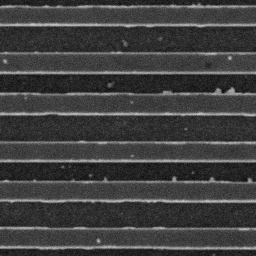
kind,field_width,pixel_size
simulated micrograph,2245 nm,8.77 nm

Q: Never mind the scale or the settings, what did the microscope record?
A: lines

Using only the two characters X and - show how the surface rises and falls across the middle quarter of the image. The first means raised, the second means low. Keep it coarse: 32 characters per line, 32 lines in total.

XXXXXXXXXXXXXXXXXXXXXXXXXXXXXXXX
XXXXXXXXXXXXXXXXXXXXXXXXXXXXXXXX
--------------------------------
--------------------------------
--------------------------------
--------------------------------
--------------------------------
-XXXXXXXXXXXXXXXX----------XXXXX
XXXXXXXXXXXXXXXXXXXXXXXXXXXXXXXX
XXXXXXXXXXXXXXXXXXXXXXXXXXXXXXXX
XXXXXXXXXXXXXXXXXXXXXXXXXXXXXXXX
XXXXXXXXXXXXXXXXXXXXXXXXXXXXXXXX
XX--XXXXXXXXXXXXXXXXXXXXXXXXXXXX
--------------------------------
--------------------------------
--------------------------------
--------------------------------
--------------------------------
--------------------------------
---XXX--------------------------
XXXXXXXXXXXXXXXXXXXXXXXXXXXXXXXX
XXXXXXXXXXXXXXXXXXXXXXXXXXXXXXXX
XXXXXXXXXXXXXXXXXXXXXXXXXXXXXXXX
XXXXXXXXXXXXXXXXXXXXXXXXXXXXXXXX
--------------------------------
--------------------------------
--------------------------------
--------------------------------
--------------------------------
XXXXXXXXXXXXXXXXXXXXXXXXXXXXXXXX
XXXXXXXXXXXXXXXXXXXXXXXXXXXXXXXX
XXXXXXXXXXXXXXXXXXXXXXXXXXXXXXXX